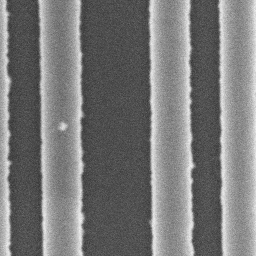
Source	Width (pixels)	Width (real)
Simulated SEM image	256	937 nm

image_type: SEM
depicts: lines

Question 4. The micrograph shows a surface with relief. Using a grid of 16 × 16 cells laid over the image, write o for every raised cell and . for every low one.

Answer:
..ooo....ooo..oo
..ooo....ooo..oo
..ooo....ooo..oo
...oo....ooo..oo
...oo....ooo..oo
o..oo....ooo..oo
...oo....ooo..oo
o..oo....ooo..oo
o..oo....ooo..oo
...oo....ooo..oo
o..oo....ooo..oo
o..oo....ooo..oo
o..oo.....oo..oo
o..oo.....oo..oo
o..oo.....oo..oo
o..oo.....oo..oo